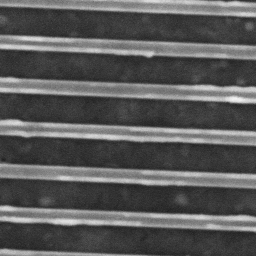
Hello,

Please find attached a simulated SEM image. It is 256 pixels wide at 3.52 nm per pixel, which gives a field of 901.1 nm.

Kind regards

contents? parallel lines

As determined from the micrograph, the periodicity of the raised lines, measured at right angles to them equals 151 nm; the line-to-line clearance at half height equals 104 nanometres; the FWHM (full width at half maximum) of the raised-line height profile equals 47.4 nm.